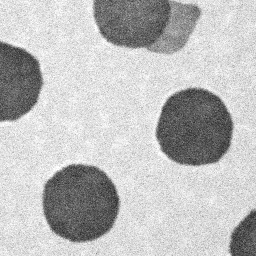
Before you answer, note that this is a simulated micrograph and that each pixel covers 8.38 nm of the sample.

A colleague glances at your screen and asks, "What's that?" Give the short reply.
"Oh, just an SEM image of holes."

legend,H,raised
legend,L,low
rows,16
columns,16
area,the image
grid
HHHHHHLLLLLLHHHH
HHHHHHLLLLLLHHHH
HHHHHHHLLLLLHHHH
LLHHHHHHHHHHHHHH
LLLHHHHHHHHHHHHH
LLLHHHHHHHHHHHHH
LLHHHHHHHHLLLLHH
LHHHHHHHHHLLLLLH
HHHHHHHHHHLLLLHH
HHHHHHHHHHLLLLHH
HHHHLLHHHHHHHHHH
HHHLLLLHHHHHHHHH
HHHLLLLHHHHHHHHH
HHHLLLLHHHHHHHHL
HHHLLLLHHHHHHHHL
HHHHHHHHHHHHHHLL